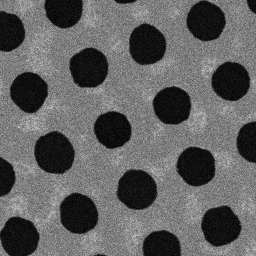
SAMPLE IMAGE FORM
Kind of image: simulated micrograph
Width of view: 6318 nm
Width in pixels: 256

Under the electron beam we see a regular array of holes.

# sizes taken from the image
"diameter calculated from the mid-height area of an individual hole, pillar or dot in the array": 0.971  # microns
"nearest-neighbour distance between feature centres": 1550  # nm